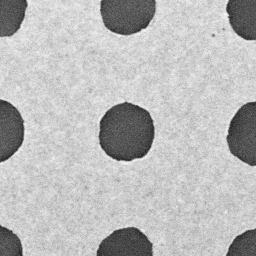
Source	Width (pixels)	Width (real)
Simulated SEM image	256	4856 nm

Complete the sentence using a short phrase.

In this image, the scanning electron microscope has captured holes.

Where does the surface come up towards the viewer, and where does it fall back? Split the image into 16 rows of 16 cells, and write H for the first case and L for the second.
LLHHHHLLLLHHHHLL
LHHHHHHLLHHHHHLL
HHHHHHHHHHHHHHHL
HHHHHHHHHHHHHHHH
HHHHHHHHHHHHHHHH
HHHHHHHHHHHHHHHH
LHHHHHHLHHHHHHHL
LHHHHHLLLLHHHHLL
LHHHHHLLLLHHHHLL
LHHHHHLLLHHHHHLL
HHHHHHHHHHHHHHHH
HHHHHHHHHHHHHHHH
HHHHHHHHHHHHHHHH
HHHHHHHHHHHHHHHH
LHHHHHHLLHHHHHHL
LHHHHHLLLLHHHHLL